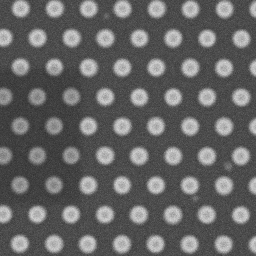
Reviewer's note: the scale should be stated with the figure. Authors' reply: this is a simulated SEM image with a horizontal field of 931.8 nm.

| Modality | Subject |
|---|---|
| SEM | an array of small figures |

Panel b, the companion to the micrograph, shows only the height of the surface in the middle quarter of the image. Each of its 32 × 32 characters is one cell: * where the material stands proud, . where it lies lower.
....****....*****....****....***
....****....*****....****....***
.....***.....***.....****.....**
................................
................................
................................
***......***......**......***...
****....****.....****....****...
****....****.....****....****...
****....****.....****.....***...
..................**............
................................
................................
.....**.......*.......**.......*
....****.....****....****.....**
....****....*****....****....***
....****.....****....****.....**
.....**......***......**......**
................................
................................
................................
****....****.....****.....***...
****....*****....****....****...
****....*****....****....****...
***......***.....****.....***...
................................
................................
................................
.....**......***......**......**
....****.....****....****....***
....****....*****....****....***
....****.....***.....****.....**